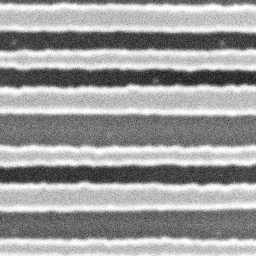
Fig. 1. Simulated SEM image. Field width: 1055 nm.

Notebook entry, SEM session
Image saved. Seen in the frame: lines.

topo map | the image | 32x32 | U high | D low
DDDDDDDDDDDDDDDDDDDDDDDDDDDDDDDD
UUUUUUUUUUUUUUUUUUUUUUUUUUUUUUUU
UUUUUUUUUUUUUUUUUUUUUUUUUUUUUUUU
UUUUUUUUUUUUUUUUUUUUUUUUUUUUUUUU
DDDDDDDDDDDDDDDDDDDDDDDDDDDDDDDD
DDDDDDDDDDDDDDDDDDDDDDDDDDDDDDDD
DDUUDUUUUUUUUUUUUUUUUUUUUUUUUUUU
UUUUUUUUUUUUUUUUUUUUUUUUUUUUUUUU
DDUUDDDDUDUUUUUUUUUUUUUUUUUUUUUU
DDDDDDDDDDDDDDDDDDDDDDDDDDDDDDDD
DDDDDDDDDDDDDDDDDDDDDDDDDDDDDDDD
UUUUUUUUUUUUUUUUUUUUUUUUUUUUUUUU
UUUUUUUUUUUUUUUUUUUUUUUUUUUUUUUU
UUUUUUUUUUUUUUUUUUUUUUUUUUUUUUUU
DDDDDDDDDDDDDDDDDDDDDDDDDDDDDDDD
DDDDDDDDDDDDDDDDDDDDDDDDDDDDDDDD
DDDDDDDDDDDDDDDDDDDDDDDDDDDDDDDD
DDDDDDDDDDDDDDDDDDDDDDDDDDDDDDDD
UUDUUDDUUDDDDDDDDDUDDUUDDUDDDDUU
UUUUUUUUUUUUUUUUUUUUUUUUUUUUUUUU
UUUUUUUUUUUUUUUUUUUUDDUUUUUUUUUU
DDDDDDDDDDDDDDDDDDDDDDDDDDDDDDDD
DDDDDDDDDDDDDDDDDDDDDDDDDDDDDDDD
UUUUUUUUUUUUUUUUUUUUUUUUUUUUUUUU
UUUUUUUUUUUUUUUUUUUUUUUUUUUUUUUU
UUUUUUUUUUUUUUUUUUUUUUUUUUUUUUUU
DDDDDDDDDDDDDDDDDDDDDDDDDDDDDDDD
DDDDDDDDDDDDDDDDDDDDDDDDDDDDDDDD
DDDDDDDDDDDDDDDDDDDDDDDDDDDDDDDD
DDDDDDDDDDDDDDDDDDDDDDDDDDDDDDDD
UUUUUUUUUUUUUUUUUUUUUUUUUUUUUUUU
UUUUUUUUUUUUUUUUUUUUUUUUUUUUUUUU